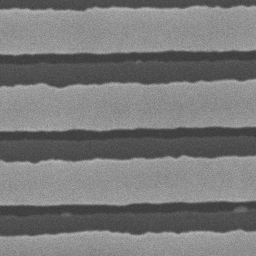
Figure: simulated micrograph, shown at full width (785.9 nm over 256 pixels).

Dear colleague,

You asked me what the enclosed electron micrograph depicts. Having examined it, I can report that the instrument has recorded lines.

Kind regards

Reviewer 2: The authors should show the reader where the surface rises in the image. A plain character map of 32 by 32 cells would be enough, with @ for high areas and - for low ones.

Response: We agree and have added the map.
--------------------------------
@@@@@@@@@@@@@@@@@@@@@@@@@@@@@@@@
@@@@@@@@@@@@@@@@@@@@@@@@@@@@@@@@
@@@@@@@@@@@@@@@@@@@@@@@@@@@@@@@@
@@@@@@@@@@@@@@@@@@@@@@@@@@@@@@@@
@@@@@@@@@@@@@@@@@@@@@@@@@@@@@@@@
@@@@@@@@@@@@@@@@@---------------
--------------------------------
--------------------------------
--------------------------------
-----@-------@@@@@--@@@@@@@@@@@@
@@@@@@@@@@@@@@@@@@@@@@@@@@@@@@@@
@@@@@@@@@@@@@@@@@@@@@@@@@@@@@@@@
@@@@@@@@@@@@@@@@@@@@@@@@@@@@@@@@
@@@@@@@@@@@@@@@@@@@@@@@@@@@@@@@@
@@@@@@@@@@@@@@@@@@@@@@@@@@@@@@@@
--------------------------------
--------------------------------
--------------------------------
--------------------------------
@@@@@@@@@@@@@@@@@@@@@@@@@@@@@@@@
@@@@@@@@@@@@@@@@@@@@@@@@@@@@@@@@
@@@@@@@@@@@@@@@@@@@@@@@@@@@@@@@@
@@@@@@@@@@@@@@@@@@@@@@@@@@@@@@@@
@@@@@@@@@@@@@@@@@@@@@@@@@@@@@@@@
@@@@@@@@-----@@@----------------
--------------------------------
--------------------------------
--------------------------------
----@@@@@@@@@@@@@@@@@@@@@@@@@@@@
@@@@@@@@@@@@@@@@@@@@@@@@@@@@@@@@
@@@@@@@@@@@@@@@@@@@@@@@@@@@@@@@@